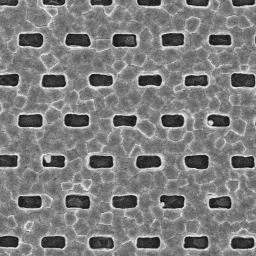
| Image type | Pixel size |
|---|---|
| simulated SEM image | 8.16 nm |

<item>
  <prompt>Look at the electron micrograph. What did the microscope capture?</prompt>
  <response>a regular array of holes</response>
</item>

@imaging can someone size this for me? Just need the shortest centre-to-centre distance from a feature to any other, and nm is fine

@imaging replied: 377